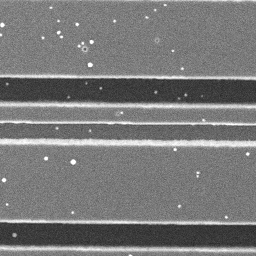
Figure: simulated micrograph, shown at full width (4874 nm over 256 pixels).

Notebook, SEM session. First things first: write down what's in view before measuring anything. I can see lines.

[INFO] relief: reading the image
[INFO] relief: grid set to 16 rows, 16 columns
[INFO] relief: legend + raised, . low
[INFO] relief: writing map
++++++++++++++++
++++++++++++++++
++++++++++++++++
++++++++++++++++
++++++++++++++++
................
................
++++++++++++++++
++++++++++++++++
++++++++++++++++
++++++++++++++++
++++++++++++++++
++++++++++++++++
++++++++++++++++
................
................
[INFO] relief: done